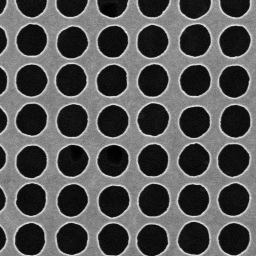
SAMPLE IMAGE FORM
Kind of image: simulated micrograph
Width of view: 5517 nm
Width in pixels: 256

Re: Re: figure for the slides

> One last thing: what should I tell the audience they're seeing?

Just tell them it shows a regular array of holes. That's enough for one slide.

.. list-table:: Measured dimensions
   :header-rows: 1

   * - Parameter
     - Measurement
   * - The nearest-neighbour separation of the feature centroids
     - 840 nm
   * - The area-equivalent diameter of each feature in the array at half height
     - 683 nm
